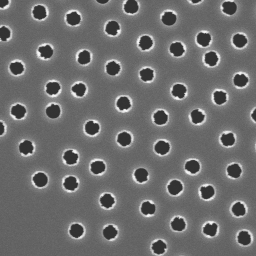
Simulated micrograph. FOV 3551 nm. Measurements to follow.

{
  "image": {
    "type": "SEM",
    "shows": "a regular array of holes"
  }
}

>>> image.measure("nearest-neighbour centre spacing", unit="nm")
431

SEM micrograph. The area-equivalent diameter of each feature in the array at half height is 190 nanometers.